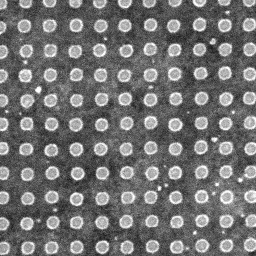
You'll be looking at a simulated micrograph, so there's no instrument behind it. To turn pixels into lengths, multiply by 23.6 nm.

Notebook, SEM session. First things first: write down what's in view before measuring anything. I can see a regular array of raised bodies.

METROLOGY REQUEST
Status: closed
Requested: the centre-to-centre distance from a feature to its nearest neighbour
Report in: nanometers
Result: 566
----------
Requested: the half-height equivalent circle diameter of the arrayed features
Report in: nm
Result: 276